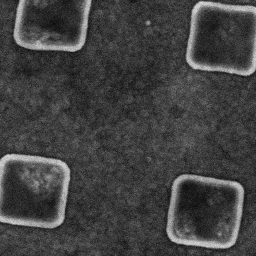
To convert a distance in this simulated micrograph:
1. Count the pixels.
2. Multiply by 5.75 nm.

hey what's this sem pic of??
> raised bodies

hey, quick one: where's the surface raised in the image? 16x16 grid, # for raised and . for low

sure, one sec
.####.......####
.####.......####
.####.......####
............####
...............#
................
................
................
................
................
####............
####.......####.
####.......####.
####.......####.
...........####.
................